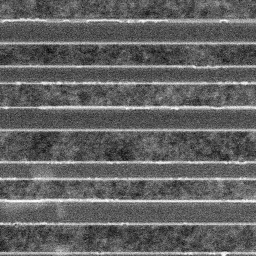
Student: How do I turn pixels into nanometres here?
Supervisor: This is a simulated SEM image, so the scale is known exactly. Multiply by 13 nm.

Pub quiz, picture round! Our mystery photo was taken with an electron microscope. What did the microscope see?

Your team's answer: lines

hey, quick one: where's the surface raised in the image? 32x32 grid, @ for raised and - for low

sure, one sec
--------------------------------
--------------------------------
--@@@-------@@------------------
@@@@@@@@@@@@@@@@@@@@@@@@@@@@@@@@
@@@@@@@@@@@@@@@@@@@@@@@@@@@@@@@@
--------------------------------
--------------------------------
--------------------------------
@@@@@@@@@@@@@@@@@@@@@@@@@@@@@@@@
@@@@@@@@@@@@@@@@@@@@@@@@@@@@@@@@
--------------------------------
--------------------------------
--------------------------------
@@@@@@@@@@@@@@@@@@@@@@@@@@@@@@@@
@@@@@@@@@@@@@@@@@@@@@@@@@@@@@@@@
@@@@@@@@@@@@@@@@@@@@@@@@@@@@@@@@
--------------------------------
--------------------------------
--------------------------------
--------------------------------
@@@@@@@@@@@@@@@@@@@@@@@@@@@@@@@@
@@@@@@@@@@@@@@@@@@@@@@@@@@@@@@@@
--------------------------------
--------------------------------
--------------------------------
@@@@@@@@@@@@@@@@@@@@@@@@@@@@@@@@
@@@@@@@@@@@@@@@@@@@@@@@@@@@@@@@@
@@@@@@@@@@@@@@@@@@@@@@@@@@@@@@@@
--------------------------------
--------------------------------
--------------------------------
--------------------------------